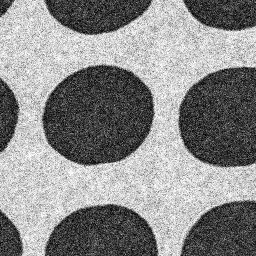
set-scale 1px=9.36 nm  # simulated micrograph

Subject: holes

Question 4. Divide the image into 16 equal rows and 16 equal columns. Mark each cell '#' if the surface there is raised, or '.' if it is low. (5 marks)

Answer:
.##......###....
####....#####...
################
################
#####...#####...
.##......###....
.##.......#.....
.##.......#.....
.##......##.....
####....####....
################
################
################
####.....####...
.##.......##....
.##.......#.....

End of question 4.